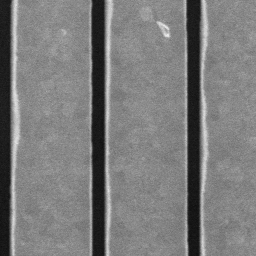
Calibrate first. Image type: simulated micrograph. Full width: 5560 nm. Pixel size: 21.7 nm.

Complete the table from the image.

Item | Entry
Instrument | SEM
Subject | lines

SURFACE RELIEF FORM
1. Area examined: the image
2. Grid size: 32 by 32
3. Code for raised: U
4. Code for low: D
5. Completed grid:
DDUUUUUUUUUDDUUUUUUUUUUDDUUUUUUU
DDUUUUUUUUUDDUUUUUUUUUUDDUUUUUUU
DDUUUUUUUUUDDUUUUUUUUUUDDUUUUUUU
DDUUUUUUUUUDDUUUUUUUUUUDDUUUUUUU
DDUUUUUUUUUDDUUUUUUUUUUDDUUUUUUU
DDUUUUUUUUUDDUUUUUUUUUUDDUUUUUUU
DDUUUUUUUUUDDUUUUUUUUUUDDUUUUUUU
DDUUUUUUUUUDDUUUUUUUUUUDDUUUUUUU
DDUUUUUUUUUDDUUUUUUUUUUDDUUUUUUU
DDUUUUUUUUUDDUUUUUUUUUUDDUUUUUUU
DDUUUUUUUUUDDUUUUUUUUUUDDUUUUUUU
DDUUUUUUUUUDDUUUUUUUUUUDDUUUUUUU
DDUUUUUUUUUDDUUUUUUUUUUDDUUUUUUU
DDUUUUUUUUUDDUUUUUUUUUUDDUUUUUUU
DDUUUUUUUUUDDUUUUUUUUUUDDUUUUUUU
DDUUUUUUUUUDDUUUUUUUUUUDDUUUUUUU
DDUUUUUUUUUDDUUUUUUUUUUDDUUUUUUU
DDUUUUUUUUUDDUUUUUUUUUUDDUUUUUUU
DDUUUUUUUUUDDUUUUUUUUUUDDUUUUUUU
DDUUUUUUUUUDDUUUUUUUUUUDDUUUUUUU
DDUUUUUUUUUDDUUUUUUUUUUDDUUUUUUU
DDUUUUUUUUUDDUUUUUUUUUUDDUUUUUUU
DDUUUUUUUUUDDUUUUUUUUUUDDUUUUUUU
DDUUUUUUUUUDDUUUUUUUUUUDDUUUUUUU
DDUUUUUUUUUDDUUUUUUUUUUDDUUUUUUU
DDUUUUUUUUUDDUUUUUUUUUUDDUUUUUUU
DDUUUUUUUUUDDUUUUUUUUUUDDUUUUUUU
DDUUUUUUUUUDDUUUUUUUUUUDDUUUUUUU
DUUUUUUUUUUDDUUUUUUUUUUDDUUUUUUU
DUUUUUUUUUUDDUUUUUUUUUUDDUUUUUUU
DUUUUUUUUUUDDUUUUUUUUUUDDUUUUUUU
DUUUUUUUUUUDDUUUUUUUUUUDDUUUUUUU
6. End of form